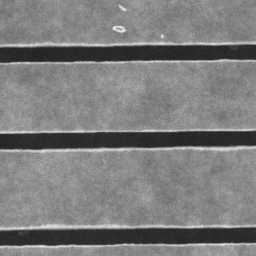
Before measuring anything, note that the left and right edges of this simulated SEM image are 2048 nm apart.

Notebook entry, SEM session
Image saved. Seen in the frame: lines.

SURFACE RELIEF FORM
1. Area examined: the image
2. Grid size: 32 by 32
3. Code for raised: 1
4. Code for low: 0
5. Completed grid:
11111111111111111111111111111111
11111111111111111111111111111111
11111111111111111111111111111111
11111111111111111111111111111111
11111111111111111111111111111111
11111111111111111111111111111111
00000000000000000000000000000000
00000000000000000000000000011000
11111111111111111111111111111111
11111111111111111111111111111111
11111111111111111111111111111111
11111111111111111111111111111111
11111111111111111111111111111111
11111111111111111111111111111111
11111111111111111111111111111111
11111111111111111111111111111111
11111111111100000000000000000000
00000000000000000000000000000000
00000000000000001001111111111111
11111111111111111111111111111111
11111111111111111111111111111111
11111111111111111111111111111111
11111111111111111111111111111111
11111111111111111111111111111111
11111111111111111111111111111111
11111111111111111111111111111111
11111111111111111111111111111111
11111111111111111111111111111111
11111111111111111000000000000000
00000000000000000000000000000000
00000000000000000000000000001111
11111111111111111111111111111111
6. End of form